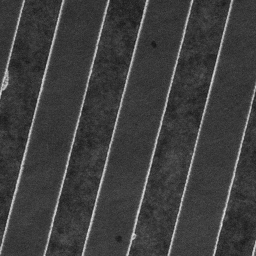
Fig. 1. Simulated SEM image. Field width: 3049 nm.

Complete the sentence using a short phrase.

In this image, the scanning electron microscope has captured lines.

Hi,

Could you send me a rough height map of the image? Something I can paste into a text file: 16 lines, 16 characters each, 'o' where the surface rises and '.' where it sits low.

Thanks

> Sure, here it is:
o...ooo..ooo..oo
o...oo...ooo..oo
o..ooo...oo...oo
o..ooo..ooo...oo
...ooo..ooo..ooo
...oo...ooo..ooo
..ooo...oo...ooo
..ooo..ooo...ooo
..ooo..ooo..ooo.
..oo...ooo..ooo.
.ooo...oo...ooo.
.ooo..ooo...ooo.
.ooo..ooo..ooo..
.oo...ooo..ooo..
ooo..ooo...ooo..
ooo..ooo...oo...